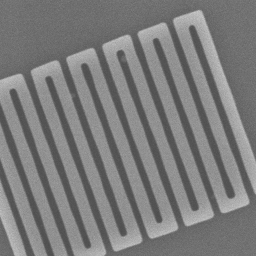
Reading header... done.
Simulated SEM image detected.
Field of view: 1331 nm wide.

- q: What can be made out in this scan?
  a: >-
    groups of lines, slits or small figures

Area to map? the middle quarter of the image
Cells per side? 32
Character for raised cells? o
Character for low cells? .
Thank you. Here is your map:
.ooo..ooo..ooo..ooo..ooo..ooo..o
.ooo..ooo...ooo.ooo...ooo..ooo..
..ooo..ooo..ooo..ooo..ooo..ooo..
..ooo..ooo..ooo..ooo..ooo..ooo..
..ooo...oo...ooo..ooo..ooo..ooo.
o..ooo..ooo..ooo..ooo..ooo..ooo.
o..ooo..ooo..ooo..ooo..ooo..oooo
oo..ooo..ooo..ooo..ooo..ooo..ooo
oo..ooo..ooo..ooo..ooo..ooo..ooo
oo..ooo..ooo..ooo..ooo...oo..ooo
oo...ooo..ooo..ooo..ooo..ooo..oo
ooo..ooo..ooo..ooo..ooo..ooo..oo
ooo..ooo..ooo...oo..ooo...ooo..o
.ooo..ooo..ooo..ooo..ooo..ooo..o
.ooo..ooo..ooo..ooo..ooo..ooo..o
.ooo..ooo..ooo..ooo...ooo.ooo...
..ooo..ooo..ooo..ooo..ooo..ooo..
..ooo..ooo..ooo..ooo..ooo..ooo..
..ooo..ooo..oooo.oooo..ooo..ooo.
o..ooo..ooo..ooo..ooo..ooo..ooo.
o..ooo..ooo..ooo..ooo..ooo..ooo.
o...oo...oo...ooo..ooo..ooo..ooo
oo..ooo..ooo..ooo..ooo..ooo..ooo
oo..ooo..ooo..ooo..ooo..ooo..ooo
oo...ooo..oo...ooo..ooo..ooo..oo
ooo..ooo..ooo..ooo..ooo..ooo..oo
ooo..ooo..ooo...oo..ooo...ooo.oo
.ooo..ooo..ooo..ooo..ooo..ooo..o
.ooo..ooo..ooo..ooo..ooo..ooo..o
.ooo..ooo...oo..ooo...oo..ooo...
..ooo..ooo..ooo..ooo..ooo..ooo..
..ooo..ooo..ooo..ooo..ooo..ooo..